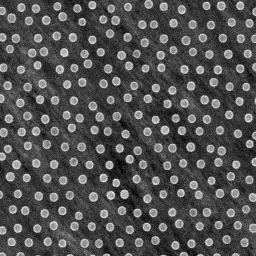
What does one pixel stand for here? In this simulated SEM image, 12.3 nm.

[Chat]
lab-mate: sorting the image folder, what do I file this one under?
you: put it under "a regular array of raised bodies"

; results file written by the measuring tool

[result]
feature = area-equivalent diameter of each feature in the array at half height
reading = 94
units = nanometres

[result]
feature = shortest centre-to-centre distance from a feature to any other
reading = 184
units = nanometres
